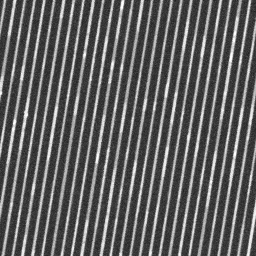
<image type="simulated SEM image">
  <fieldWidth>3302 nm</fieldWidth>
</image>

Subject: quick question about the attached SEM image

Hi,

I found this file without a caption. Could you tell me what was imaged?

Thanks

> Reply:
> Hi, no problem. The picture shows parallel lines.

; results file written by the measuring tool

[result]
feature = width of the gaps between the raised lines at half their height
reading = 97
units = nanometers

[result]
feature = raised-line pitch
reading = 0.125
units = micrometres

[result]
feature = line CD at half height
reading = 22.3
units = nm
